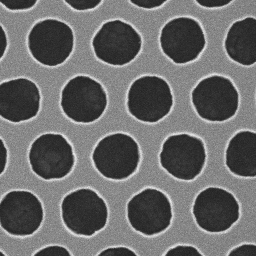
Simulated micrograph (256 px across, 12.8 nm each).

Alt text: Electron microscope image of a regular array of holes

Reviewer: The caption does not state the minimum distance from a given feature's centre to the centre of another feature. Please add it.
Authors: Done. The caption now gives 829 nm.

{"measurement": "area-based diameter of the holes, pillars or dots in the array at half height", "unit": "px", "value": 45.7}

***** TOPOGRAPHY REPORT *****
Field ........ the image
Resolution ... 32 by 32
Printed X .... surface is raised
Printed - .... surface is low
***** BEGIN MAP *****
----XXXXX---XXXXX---XXXXX---XXXX
XXXXXXXXXXXXXXXXXXXXXXXXXXXXXXXX
XXXXXX-XXXXXXXXXXXXXXX--XXXXXX--
XXXX-----XXXX----XXX-----XXXX---
-XXX-----XXX-----XXX-----XXX----
-XXX-----XXX------XX------XX----
-XXX-----XXX-----XXXX----XXX----
XXXXX---XXXXX---XXXXXX--XXXXX---
XXXXXXXXXXXXXXXXXXXXXXXXXXXXXXXX
XXXXXXXXXX-XXXXXXXXXXXXXXXXXXXXX
----XXXX----XXXXX----XXXX----XXX
-----XXX-----XXX-----XXX------XX
-----XXX-----XXX------XX------XX
-----XXX-----XXX-----XXX------XX
----XXXXX----XXXX----XXXX----XXX
XXXXXXXXXXXXXXXXXXXXXXXXXXXXXXXX
XXXXXXXXXXXXXXXXXXXXXXXXXXXXXX-X
XXXX----XXXXX----XXXX----XXXX---
-XXX-----XXX-----XXX------XX----
-XXX-----XXX-----XXX------XX----
-XXX-----XXX-----XXX------XX----
XXXX-----XXX-----XXXX----XXXX---
XXXXXXXXXXXXXXXXXXXXXXXXXXXXXXXX
XXXXXXXXXXXXXXXXXXXXXXXXXX-XXXXX
X---XXXX----XXXXX----XXXX----XXX
-----XXX-----XXX-----XXX------XX
-----XXX-----XXX-----XXX------XX
-----XXX-----XXX-----XXXX-----XX
-----XXXX----XXXX----XXXX----XXX
XXXXXXXXXXXXXXXXXXXXXXXXXXXXXXXX
XXXXXXXXXXXXXXXXXXXXXXXXXXXXXXXX
XXXXX----XXXX----XXXX----XXXX---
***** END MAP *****